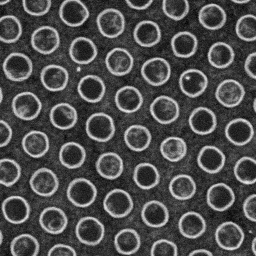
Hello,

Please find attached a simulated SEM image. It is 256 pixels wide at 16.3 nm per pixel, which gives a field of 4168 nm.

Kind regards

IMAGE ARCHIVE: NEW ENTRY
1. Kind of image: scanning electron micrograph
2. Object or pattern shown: a regular array of raised bodies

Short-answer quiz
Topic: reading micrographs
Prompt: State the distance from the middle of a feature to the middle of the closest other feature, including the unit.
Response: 622 nm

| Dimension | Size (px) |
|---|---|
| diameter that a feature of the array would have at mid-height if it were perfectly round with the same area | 25.5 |